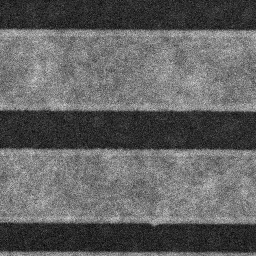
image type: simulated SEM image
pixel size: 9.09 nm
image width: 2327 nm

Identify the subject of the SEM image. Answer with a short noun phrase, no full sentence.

one or a few lines or trenches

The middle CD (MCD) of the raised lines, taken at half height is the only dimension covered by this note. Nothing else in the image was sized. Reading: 651 nm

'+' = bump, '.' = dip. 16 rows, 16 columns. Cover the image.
................
................
++++++++++++++++
++++++++++++++++
++++++++++++++++
++++++++++++++++
++++++++++++++++
................
................
................
++++++++++++++++
++++++++++++++++
++++++++++++++++
++++++++++++++++
................
................